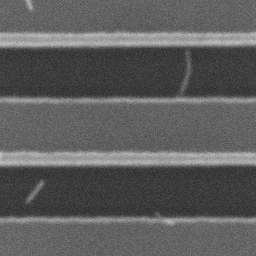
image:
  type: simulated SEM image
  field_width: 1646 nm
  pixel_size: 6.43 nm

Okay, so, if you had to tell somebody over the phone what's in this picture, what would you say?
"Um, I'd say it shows lines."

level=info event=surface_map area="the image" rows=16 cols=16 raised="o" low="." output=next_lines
oooooooooooooooo
oooooooooooooooo
oooooooooooooooo
................
................
................
oooooooooooooooo
oooooooooooooooo
oooooooooooooooo
oooooooooooooooo
................
................
................
................
oooooooooooooooo
oooooooooooooooo